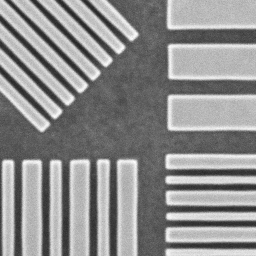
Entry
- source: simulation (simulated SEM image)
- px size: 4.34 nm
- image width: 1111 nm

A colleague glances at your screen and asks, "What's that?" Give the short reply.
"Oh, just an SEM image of groups of lines, slits or small figures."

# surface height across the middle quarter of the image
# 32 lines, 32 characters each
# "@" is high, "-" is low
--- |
@---@@@@------------------@@@@@@
@@--@@@@@-----------------@@@@@@
@@@--@@@@-----------------@@@@@@
@@@@--@@------------------@@@@@@
-@@@@---------------------------
--@@@@--------------------------
@--@@---------------------------
@@------------------------------
@@------------------------@@@@@@
@@------------------------@@@@@@
--------------------------@@@@@@
--------------------------@@@@@@
--------------------------@@@@@@
--------------------------@@@@@@
--------------------------@@@@@@
--------------------------@@@@@@
--------------------------------
--------------------------------
--------------------------------
--------------------------------
--------------------------------
--------------------------------
--------------------------------
--------------------------@@@@@@
--@@@@--@@@--@@@@@--------@@@@@@
--@@@@--@@@--@@@@@--------@@@@@@
--@@@@--@@@--@@@@@--------------
--@@@@--@@@--@@@@@--------------
--@@@@--@@@---@@@@--------@@@@@@
--@@@@--@@@---@@@@--------@@@@@@
--@@@@--@@@---@@@@--------------
--@@@@--@@@---@@@@--------------